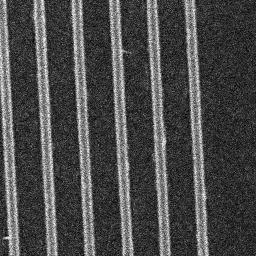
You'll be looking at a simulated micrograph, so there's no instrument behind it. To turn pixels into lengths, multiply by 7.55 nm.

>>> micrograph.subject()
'parallel lines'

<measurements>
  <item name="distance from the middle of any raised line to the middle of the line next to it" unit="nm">284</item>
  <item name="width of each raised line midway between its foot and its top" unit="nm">65.9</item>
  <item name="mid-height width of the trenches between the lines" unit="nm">218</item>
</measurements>